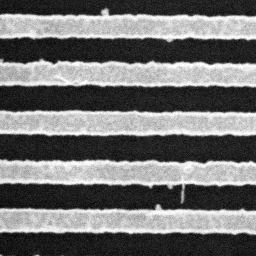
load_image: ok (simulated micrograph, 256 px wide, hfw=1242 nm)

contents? lines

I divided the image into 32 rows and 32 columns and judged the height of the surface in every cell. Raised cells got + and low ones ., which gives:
................................
................................
++++++++++++++++++++++++++++++++
++++++++++++++++++++++++++++++++
++++++++++++++++++++++++++++++++
................................
................................
................................
++++++++++++++++++++++++++++++++
++++++++++++++++++++++++++++++++
++++++++++..++++++++++++++++++++
................................
................................
................................
++++++++++++++++++++++++++++++++
++++++++++++++++++++++++++++++++
++++++++++++++++++++++++++++++++
................................
................................
................................
+++++++++++++++++++++++++.++++++
++++++++++++++++++++++++++++++++
++++++++++++++++++++++++++++++++
................................
................................
................................
++++++++++++++++++++++++++.++++.
++++++++++++++++++++++++++++++++
++++++++++++++++++++++++++++++++
................................
................................
................................